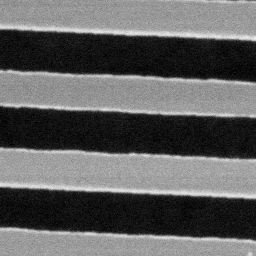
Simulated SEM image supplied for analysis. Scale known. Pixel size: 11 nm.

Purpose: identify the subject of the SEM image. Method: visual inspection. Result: lines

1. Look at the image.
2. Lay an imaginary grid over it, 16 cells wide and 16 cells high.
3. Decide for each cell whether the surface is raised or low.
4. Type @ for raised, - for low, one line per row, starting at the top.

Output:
@@@@@@@@@@@@@@@@
@@@@@@@@@@@@@@@@
----------------
----------------
@@--------------
@@@@@@@@@@@@@@@@
@@@@@@@@@@@@@@@@
----------------
----------------
@@@@@-----------
@@@@@@@@@@@@@@@@
@@@@@@@@@@@@@@@@
----------------
----------------
@@@-------------
@@@@@@@@@@@@@@@@